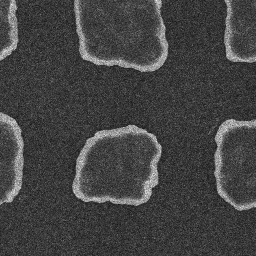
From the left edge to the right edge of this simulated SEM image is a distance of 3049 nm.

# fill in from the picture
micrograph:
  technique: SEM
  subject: raised bodies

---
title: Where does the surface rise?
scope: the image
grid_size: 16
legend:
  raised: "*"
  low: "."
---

*....*****....**
*....*****....**
*....*****....**
.....*****....**
................
................
................
*...............
*.....***.....**
*....*****....**
*....*****...***
*....*****....**
.....****.....**
................
................
................